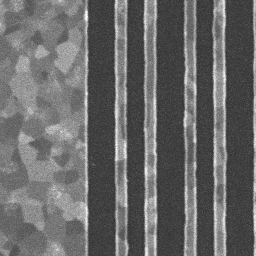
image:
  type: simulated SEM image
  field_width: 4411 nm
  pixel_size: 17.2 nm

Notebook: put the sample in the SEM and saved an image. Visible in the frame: parallel lines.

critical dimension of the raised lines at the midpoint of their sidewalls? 166 nm